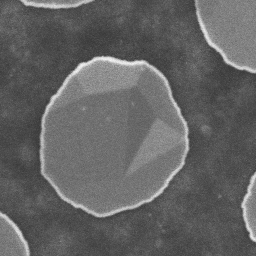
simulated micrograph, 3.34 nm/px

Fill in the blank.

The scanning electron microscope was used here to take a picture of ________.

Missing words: raised bodies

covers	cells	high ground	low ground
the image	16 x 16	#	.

...#........####
............####
.............###
..............##
.....#####......
....#######.....
...########.....
...########.....
...#########....
...#########....
...########.....
...#######......
....#####......#
......#........#
#...............
##..............